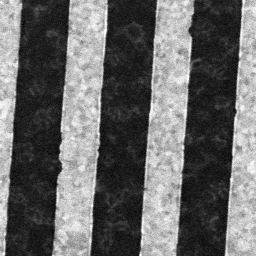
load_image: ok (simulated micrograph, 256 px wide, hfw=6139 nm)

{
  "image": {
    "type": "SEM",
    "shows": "one or a few lines or trenches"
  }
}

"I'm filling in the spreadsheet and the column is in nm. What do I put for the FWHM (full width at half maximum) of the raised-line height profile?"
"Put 843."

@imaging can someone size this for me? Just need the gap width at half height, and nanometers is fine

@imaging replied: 1210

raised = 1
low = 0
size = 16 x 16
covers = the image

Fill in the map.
1000111000110001
1000111000110001
1000111000110001
1000110000110001
1000110000110001
1000110000110001
1000110001110001
1000110001110001
1000110001110001
1000110001100001
1000110001100001
1000110001100011
0000110001100011
0001110001100011
0001110001100011
0001110001100011